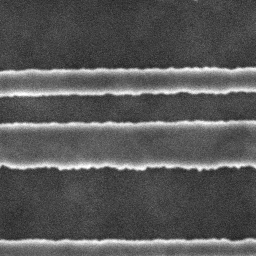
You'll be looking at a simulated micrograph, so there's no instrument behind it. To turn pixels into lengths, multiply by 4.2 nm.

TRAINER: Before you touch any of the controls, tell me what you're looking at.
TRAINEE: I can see lines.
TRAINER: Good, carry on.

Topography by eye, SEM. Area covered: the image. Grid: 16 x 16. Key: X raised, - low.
----------------
----------------
----------------
----------------
XXXXXXXXXXXXXXXX
XXXXXXXXXXXXXXXX
XXXXXXXXXXXXXXXX
XXXXXXXXXXXXXXXX
XXXXXXXXXXXXXXXX
XXXXXXXXXXXXXXXX
----X---X---X---
----------------
----------------
----------------
----------------
XXXXXXXXXXXXXXXX